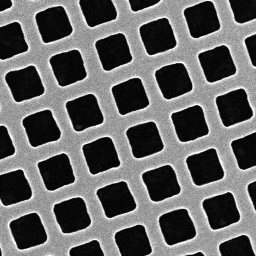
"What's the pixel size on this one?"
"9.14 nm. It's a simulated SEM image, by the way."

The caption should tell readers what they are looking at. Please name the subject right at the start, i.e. a regular array of holes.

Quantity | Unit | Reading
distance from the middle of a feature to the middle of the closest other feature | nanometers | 422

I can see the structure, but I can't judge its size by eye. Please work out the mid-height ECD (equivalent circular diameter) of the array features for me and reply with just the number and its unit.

35.5 px